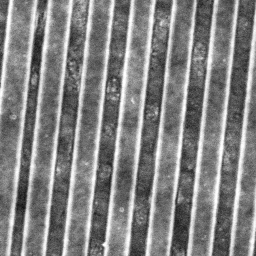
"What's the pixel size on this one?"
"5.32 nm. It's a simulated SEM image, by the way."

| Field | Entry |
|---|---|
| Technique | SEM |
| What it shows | parallel lines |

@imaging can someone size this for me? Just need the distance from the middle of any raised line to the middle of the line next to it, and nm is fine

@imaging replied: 218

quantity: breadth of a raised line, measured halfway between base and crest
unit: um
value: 0.116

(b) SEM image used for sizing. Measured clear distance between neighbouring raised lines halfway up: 102 nm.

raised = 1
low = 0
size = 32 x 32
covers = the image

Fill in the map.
01110011100111001110001100011100
01110011100111001110001100011000
01110011100111001110001100011000
01110011100111001110011100011000
01110011000111001110011100111000
01110011000111001110011100111000
01110111000110001110011100111001
01110111000110001100011100111001
11110111001110001100011100111001
11110111001110001100011000111001
11100111001110011100011000111001
11100111001110011100011000110001
11100111001110011100111000110001
11100111001110011100111001110001
11100110001110011100111001110001
11100110001100011100111001110001
11101110001100011000111001110011
11101110001100011000111001110011
11001110011100011000111001110011
11001110011100111000110001110011
11001110011100111000110001100011
11001110011100111001110001100011
11001110011100111001110001100011
11001100011100111001110011100011
11001100011100111001110011100011
11011100011000111001110011100111
11011100011000110001110011100111
11011100111000110001110011100111
10011100111001110001100011100111
10011100111001110001100011100111
10011100111001110001100011000111
10011100111001110011100011000110